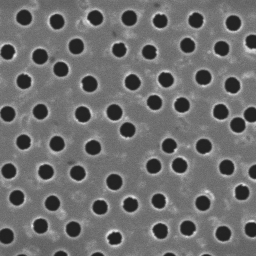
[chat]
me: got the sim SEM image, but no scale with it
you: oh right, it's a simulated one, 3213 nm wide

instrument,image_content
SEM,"a regular array of holes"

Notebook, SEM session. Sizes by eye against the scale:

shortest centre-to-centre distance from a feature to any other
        361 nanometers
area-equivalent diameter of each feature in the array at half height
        196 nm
